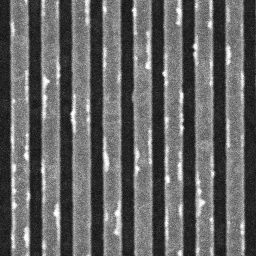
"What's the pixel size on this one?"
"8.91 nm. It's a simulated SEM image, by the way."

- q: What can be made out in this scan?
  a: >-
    parallel lines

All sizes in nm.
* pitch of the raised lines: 274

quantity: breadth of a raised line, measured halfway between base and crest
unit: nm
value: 157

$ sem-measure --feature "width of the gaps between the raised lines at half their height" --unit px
13.3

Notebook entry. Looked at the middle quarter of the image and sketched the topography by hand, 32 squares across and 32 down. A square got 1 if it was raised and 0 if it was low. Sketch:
00111100001111000011110001111000
00111100001111000011110001111000
00111100001111000011110001111000
00111100001111000011110001111000
00111100001111000011110001111000
00111100001111000011110001111000
00111100001111000011110001111000
00111100001111000111110001111100
00111100001111000111110001111100
00111100001111000111110001111100
00111100001111000011110001111000
00111100001111000011110001111000
00111100001111000011110001111100
00111100001111000011110001111100
00111100001111000011110001111100
00111100001111000011110001111100
00111100001111000011110001111100
00111100001111000011110001111000
00111100001111000011110000111000
00111110001111000011110001111000
00111110001111000011110000111000
00111110001111000011110001111000
00111110001111000011110001111000
00111110001111000011110001111000
00111110001111000011110001111000
00111110001111000011110001111000
00111110001111000011110001111100
00111110001111000011110000111100
00111100001111000011110001111100
00111100001111000011110001111100
00111100001111000011110001111100
00111100001111000011110001111100